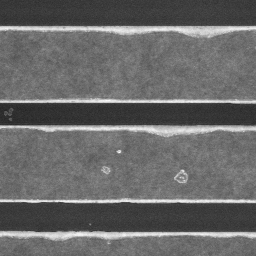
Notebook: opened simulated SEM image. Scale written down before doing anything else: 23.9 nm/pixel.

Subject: lines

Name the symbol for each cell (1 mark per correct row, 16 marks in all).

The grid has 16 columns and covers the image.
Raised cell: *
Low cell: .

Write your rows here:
................
................
****************
****************
****************
****************
................
................
****************
****************
****************
****************
****************
................
................
****************